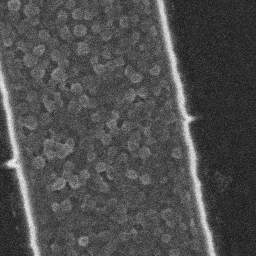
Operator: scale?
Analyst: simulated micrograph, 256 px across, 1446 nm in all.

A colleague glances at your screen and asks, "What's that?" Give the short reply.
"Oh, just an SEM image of one or a few lines or trenches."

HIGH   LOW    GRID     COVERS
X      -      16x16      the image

XXXXXXXXXX------
XXXXXXXXXX------
XXXXXXXXXXX-----
XXXXXXXXXXX-----
XXXXXXXXXXX-----
XXXXXXXXXXX-----
XXXXXXXXXXX-----
-XXXXXXXXXXX----
-XXXXXXXXXXX----
-XXXXXXXXXXX----
-XXXXXXXXXXX----
-XXXXXXXXXXX----
--XXXXXXXXXX----
--XXXXXXXXXXX---
--XXXXXXXXXXX---
--XXXXXXXXXXX---